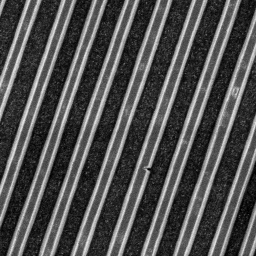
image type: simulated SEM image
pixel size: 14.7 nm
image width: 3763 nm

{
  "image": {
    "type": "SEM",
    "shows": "parallel lines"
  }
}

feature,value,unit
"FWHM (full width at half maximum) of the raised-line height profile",10.8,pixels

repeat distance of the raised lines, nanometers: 462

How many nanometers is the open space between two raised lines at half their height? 305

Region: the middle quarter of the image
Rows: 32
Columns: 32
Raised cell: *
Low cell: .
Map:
..***.....***.....***......***..
..**......**......***......***..
.***.....***.....***......***...
.***.....***.....***......***...
.**......**......***......**....
***.....***.....***......***....
***.....***.....***......***....
**......**......***......***....
**.....***......**......***.....
**.....***.....***......***.....
*......**......***......***.....
*.....***......**......***......
*.....***.....***......***.....*
......**......***.....****.....*
.....***......**......***......*
.....***.....***......***.....**
.....**......***.....****.....**
....***......**......***......**
....***.....***......***.....***
....**......***.....****.....***
...***.....***......***......***
...***.....***......***.....***.
...**......***.....***......***.
..***......**......***......***.
..***.....***......***.....***..
..**......***.....****.....***..
.***......**......***......**...
.***.....***......***.....***...
.**......***.....****.....***...
***......**......***......**....
***.....***......***.....***....
**......***.....****.....***....